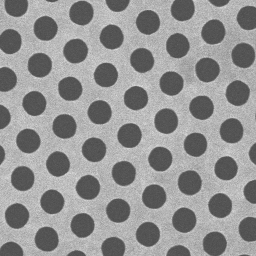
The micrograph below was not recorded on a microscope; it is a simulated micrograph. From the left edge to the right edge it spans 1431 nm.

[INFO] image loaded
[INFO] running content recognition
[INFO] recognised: a regular array of holes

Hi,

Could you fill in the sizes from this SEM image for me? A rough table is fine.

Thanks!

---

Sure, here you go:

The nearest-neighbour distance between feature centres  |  37.7 pixels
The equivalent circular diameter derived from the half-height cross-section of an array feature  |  135 nanometers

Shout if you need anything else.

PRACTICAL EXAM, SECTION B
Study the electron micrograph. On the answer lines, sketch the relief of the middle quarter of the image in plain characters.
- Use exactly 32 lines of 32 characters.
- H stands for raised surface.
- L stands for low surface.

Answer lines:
HHHHHHHHLLLLHHHHHLLLLLHHHHHHHHHH
HHHHHHHHLLLLLHHHHHLLLHHHHHHHHHHH
HHHHHHHLLLLLLHHHHHHHHHHHHLLLLHHH
LLLHHHHHLLLLLHHHHHHHHHHHLLLLLLHH
LLLLHHHHLLLLLHHHHHHHHHHHLLLLLLHH
LLLLHHHHHLLLHHHHHHHHHHHHLLLLLLHH
LLLLLHHHHHHHHHHHLLLLHHHHLLLLLHHH
LLLLHHHHHHHHHHHLLLLLLHHHHLLLHHHH
LLLLHHHHHHHHHHHLLLLLLHHHHHHHHHHH
HHHHHHHLLLHHHHHLLLLLLHHHHHHHHHHH
HHHHHHLLLLLHHHHHLLLLHHHHHHHHHHHL
HHHHHHLLLLLLHHHHHLHHHHHHLLLHHHHL
HHHHHHLLLLLLHHHHHHHHHHHLLLLLHHHH
LLHHHHLLLLLLHHHHHHHHHHHLLLLLHHHH
LLLHHHHLLLLHHHHHHHHHHHHLLLLLHHHH
LLLHHHHHHHHHHHHLLLHHHHHLLLLLHHHH
LLLHHHHHHHHHHHLLLLLHHHHLLLLLHHHH
LLLHHHHHHHHHHLLLLLLHHHHHHHHHHHHH
LHHHHHHLHHHHHLLLLLLHHHHHHHHHHHHL
HHHHHLLLLLHHHHLLLLLHHHHHHHHHHHLL
HHHHHLLLLLHHHHHLLLHHHHHHHHHHHHLL
HHHHLLLLLLLHHHHHHHHHHHLLLLHHHHLL
HHHHHLLLLLHHHHHHHHHHHLLLLLLHHHHL
LHHHHLLLLLHHHHHHHHHHHLLLLLLHHHHH
LHHHHHHLHHHHHHLLHHHHHLLLLLLHHHHH
LHHHHHHHHHHHLLLLLHHHHHLLLLLHHHHH
LHHHHHHHHHHHLLLLLLHHHHHLLHHHHHHH
HHHHHHHHHHHHLLLLLLHHHHHHHHHHHLLL
HHHHLLLLHHHHLLLLLLHHHHHHHHHHHLLL
HHHLLLLLLHHHHLLLLHHHHHHHHHHHLLLL
HHHLLLLLLHHHHHHHHHHHHLLLHHHHHLLL
HHHLLLLLLHHHHHHHHHHHLLLLLHHHHLLL